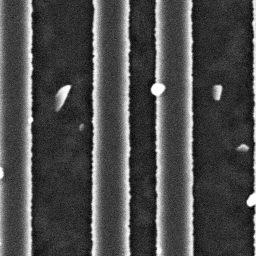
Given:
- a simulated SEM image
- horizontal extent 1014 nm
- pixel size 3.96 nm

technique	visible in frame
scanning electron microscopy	lines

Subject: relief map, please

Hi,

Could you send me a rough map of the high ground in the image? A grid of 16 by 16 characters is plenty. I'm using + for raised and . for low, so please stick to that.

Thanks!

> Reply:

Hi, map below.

++....++..++....
++....++..++....
++....++..++....
++....++..++....
++....++..++....
++....++..++....
++....++..++....
++....++..++....
++....++..++....
++....++..++....
++....++..++....
++....++..++....
++....++..++....
++....++..++....
++....++..++....
++....++..++....